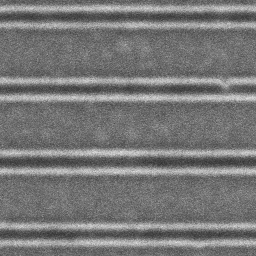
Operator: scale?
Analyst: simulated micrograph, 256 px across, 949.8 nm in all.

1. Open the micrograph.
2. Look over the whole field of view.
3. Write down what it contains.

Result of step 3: one or a few lines or trenches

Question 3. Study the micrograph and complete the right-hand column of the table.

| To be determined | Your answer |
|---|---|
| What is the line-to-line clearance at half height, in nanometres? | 202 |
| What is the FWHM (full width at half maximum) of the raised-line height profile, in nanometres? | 65.3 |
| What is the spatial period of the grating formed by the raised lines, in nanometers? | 269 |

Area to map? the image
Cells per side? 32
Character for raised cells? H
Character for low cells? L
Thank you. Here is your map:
LLLLLLLLLLLLLLLLLLLLLLLLLLLLLLLL
HHHHHHHHHHHHHHHHHHHHHHHHHHHHHHHH
HHHHHHHHHHHHHHHHHHHHHHHHHHHHHHHH
LLLLLLLLLLLLLLLLLLLLLLLLLLLLLLLL
LLLLLLLLLLLLLLLLLLLLLLLLLLLLLLLL
LLLLLLLLLLLLLLLLLLLLLLLLLLLLLLLL
LLLLLLLLLLLLLLLLLLLLLLLLLLLLLLLL
LLLLLLLLLLLLLLLLLLLLLLLLLLLLLLLL
LLLLLLLLLLLLLLLLLLLLLLLLLLLLLLLL
LLLLLLLLLLLLLLLLLLLLLLLLLLLLLLLL
HHHHHHHHHHHHHHHHHHHHHHHHHHHHHHHH
HHHHHHHHHHHHHHHHHHHHHHHHHHHHHHHH
LLLLLLLLLLLLLLLLLLLLLLLLLLLLLLLL
LLLLLLLLLLLLLLLLLLLLLLLLLLLLLLLL
LLLLLLLLLLLLLLLLLLLLLLLLLLLLLLLL
LLLLLLLLLLLLLLLLLLLLLLLLLLLLLLLL
LLLLLLLLLLLLLLLLLLLLLLLLLLLLLLLL
LLLLLLLLLLLLLLLLLLLLLLLLLLLLLLLL
LLLLLLLLLLLLLLLLLLLLLLLLLLLLLLLL
HHHHHHHHHHHHHHHHHHHHHHHHHHHHHHHH
HHHHHHHHHHHHHHHHHHHHHHHHHHHHHHHH
LLLLLLLLLLLHHLLLLLLLLLLLLLLLLLLL
LLLLLLLLLLLLLLLLLLLLLLLLLLLLLLLL
LLLLLLLLLLLLLLLLLLLLLLLLLLLLLLLL
LLLLLLLLLLLLLLLLLLLLLLLLLLLLLLLL
LLLLLLLLLLLLLLLLLLLLLLLLLLLLLLLL
LLLLLLLLLLLLLLLLLLLLLLLLLLLLLLLL
LLLLLLLLLLLLLLLLLLLLLLLLLLLLLLLL
HHHHHHHHHHHHHHHHHHHHHHHHHHHHHHHH
HHHHHHHHHHHHHHHHHHHHHHHHHHHHHHHH
LLLLLLLLLLLLLLLLLLLLLLLLHHLLLLLL
LLLLLLLLLLLLLLLLLLLLLLLLLLLLLLLL